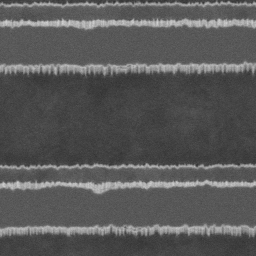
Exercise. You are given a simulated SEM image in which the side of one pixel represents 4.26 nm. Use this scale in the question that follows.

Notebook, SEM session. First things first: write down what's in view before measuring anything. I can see lines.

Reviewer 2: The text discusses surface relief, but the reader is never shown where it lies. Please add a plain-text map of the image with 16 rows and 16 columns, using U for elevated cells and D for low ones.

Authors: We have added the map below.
UUUUUUUUUUUUUUUU
UUUUUUUUUUUUUUUU
UUUUUUUUUUUUUUUU
UUUUUUUUUUUUUUUU
DDDDDDDDDDDDDDDD
DDDDDDDDDDDDDDDD
DDDDDDDDDDDDDDDD
DDDDDDDDDDDDDDDD
DDDDDDDDDDDDDDDD
DDDDDDDDDDDDDDDD
UUUUUUUUUUUUUUUU
UUUUUUUUUUUUUUUU
UUUUUUUUUUUUUUUU
UUUUUUUUUUUUUUUU
DDDDDDDDDDDDDDDD
DDDDDDDDDDDDDDDD